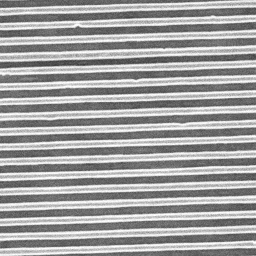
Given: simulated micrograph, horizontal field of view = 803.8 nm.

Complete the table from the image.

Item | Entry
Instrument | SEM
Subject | parallel lines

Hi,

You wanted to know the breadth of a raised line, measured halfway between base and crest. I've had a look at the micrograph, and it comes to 0.02 microns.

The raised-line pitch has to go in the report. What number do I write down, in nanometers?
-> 47.2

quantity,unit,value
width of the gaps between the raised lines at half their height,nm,28.6